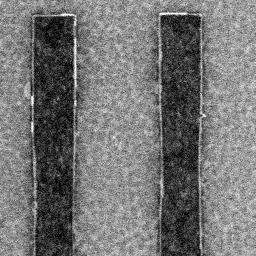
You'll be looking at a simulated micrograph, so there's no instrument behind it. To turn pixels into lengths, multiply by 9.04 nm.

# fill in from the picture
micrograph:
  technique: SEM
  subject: one or a few lines or trenches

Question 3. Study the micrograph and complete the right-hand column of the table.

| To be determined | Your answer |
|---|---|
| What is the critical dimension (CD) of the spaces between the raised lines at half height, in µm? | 0.78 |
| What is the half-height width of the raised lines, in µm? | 0.37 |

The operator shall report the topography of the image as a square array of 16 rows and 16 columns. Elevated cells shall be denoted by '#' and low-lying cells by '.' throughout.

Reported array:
................
..###.....###...
..###.....###...
..###.....###...
..###.....###...
..###.....###...
..###.....###...
..###.....###...
..###.....###...
..###.....##....
..###.....##....
..###.....##....
..###.....##....
..###.....###...
..###.....###...
..###.....###...